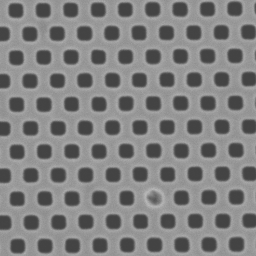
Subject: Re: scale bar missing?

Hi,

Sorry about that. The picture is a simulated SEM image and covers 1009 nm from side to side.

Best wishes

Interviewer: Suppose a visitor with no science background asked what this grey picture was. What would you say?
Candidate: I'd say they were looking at a regular array of holes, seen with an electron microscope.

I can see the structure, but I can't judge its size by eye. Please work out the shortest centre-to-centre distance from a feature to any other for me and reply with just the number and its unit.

106 nm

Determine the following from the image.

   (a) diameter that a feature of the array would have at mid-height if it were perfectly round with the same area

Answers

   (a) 0.0606 µm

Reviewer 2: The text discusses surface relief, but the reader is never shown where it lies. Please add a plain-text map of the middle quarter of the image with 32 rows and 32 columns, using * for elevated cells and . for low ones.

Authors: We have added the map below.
********************************
********************************
****..*****..*****..****...****.
***....***....***....***....***.
***....***....***....***....***.
****...****...***...****...****.
********************************
********************************
*..****...****...****...****...*
....***....***...***....***....*
....***....***...***....***....*
*..****...****...*****.*****..**
********************************
********************************
****...****...***...****...****.
***....***....***....***....***.
***....***....***....***....***.
****...****..*****..*****..*****
********************************
********************************
...****...****...****...****...*
....***....***...****...***....*
....***....***...****...****...*
*..*****..*****.******.******.**
********************************
********************************
****...****...***....***....***.
****...***....***....***....***.
****...***....***....***....***.
****..*****.********************
********************************
********************************